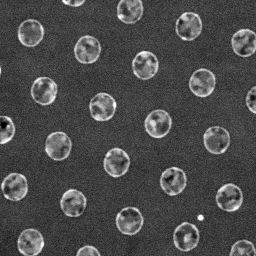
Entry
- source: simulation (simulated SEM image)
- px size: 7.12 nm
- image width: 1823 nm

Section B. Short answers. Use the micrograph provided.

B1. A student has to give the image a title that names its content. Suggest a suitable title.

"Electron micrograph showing a regular array of raised bodies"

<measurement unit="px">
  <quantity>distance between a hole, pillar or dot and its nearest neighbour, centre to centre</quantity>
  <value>57.8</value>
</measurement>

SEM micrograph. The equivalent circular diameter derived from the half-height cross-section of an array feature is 187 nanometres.